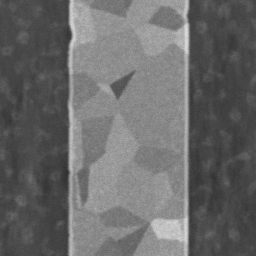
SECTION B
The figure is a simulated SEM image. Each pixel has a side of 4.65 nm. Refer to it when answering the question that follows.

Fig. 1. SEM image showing one or a few lines or trenches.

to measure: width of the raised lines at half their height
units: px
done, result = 114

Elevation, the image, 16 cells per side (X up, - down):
----XXXXXXXX----
-----XXXXXXX----
-----XXXXXXX----
----XXXXXXXX----
----XXXXXXXX----
-----XXXXXXX----
----XXXXXXXX----
----XXXXXXXX----
----XXXXXXXX----
----XXXXXXXX----
----XXXXXXXX----
----XXXXXXXX----
----XXXXXXXX----
----XXXXXXXX----
----XXXXXXXX----
----XXXXXXXX----